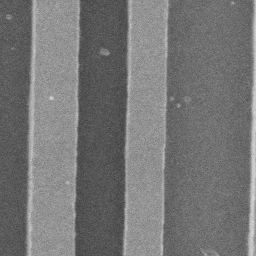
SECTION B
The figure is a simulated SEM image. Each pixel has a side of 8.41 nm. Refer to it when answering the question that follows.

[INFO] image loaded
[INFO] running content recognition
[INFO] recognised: lines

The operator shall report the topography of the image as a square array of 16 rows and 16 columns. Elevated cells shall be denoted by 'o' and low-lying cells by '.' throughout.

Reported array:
..ooo...oo......
..ooo...oo......
..ooo...oo......
..ooo...oo......
..ooo...oo......
..ooo...oo......
..ooo...oo......
..ooo...oo......
..ooo...oo......
..ooo...oo......
..ooo...oo......
..ooo...oo......
..ooo...oo......
..ooo...oo......
..ooo...oo......
..ooo...oo......